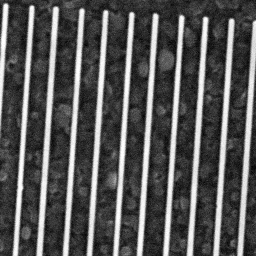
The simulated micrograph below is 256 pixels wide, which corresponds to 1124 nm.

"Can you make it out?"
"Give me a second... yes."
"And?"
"parallel lines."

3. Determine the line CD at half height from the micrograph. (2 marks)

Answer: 12.6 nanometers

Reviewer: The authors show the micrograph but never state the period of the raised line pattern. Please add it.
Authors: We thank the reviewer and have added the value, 110 nm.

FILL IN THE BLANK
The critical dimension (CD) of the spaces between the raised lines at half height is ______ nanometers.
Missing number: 93.1